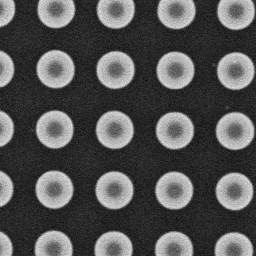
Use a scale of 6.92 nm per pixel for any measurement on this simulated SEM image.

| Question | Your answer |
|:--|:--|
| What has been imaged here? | an array of small figures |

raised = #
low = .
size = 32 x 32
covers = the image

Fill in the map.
##...####...#####...####...#####
##...####...#####...####...#####
#....####....###....####...#####
.....................##......#..
................................
................................
......##......#.................
#....####...####....####....###.
##...####...#####...####...#####
##...####...#####...####...#####
#.....##.....###....###.....###.
................................
................................
................................
#....###.....###....###.....###.
##...####...#####...####...#####
##...####...#####...####...#####
#....####...####....####...####.
..............#......##......#..
................................
................................
......##........................
#....####...####....####....###.
##...####...#####..#####...#####
#....####...#####...####...#####
#....###.....###....###.....###.
................................
................................
................................
#....###.....###....###.....###.
#....####...####....####...####.
#...#####...####...#####...#####